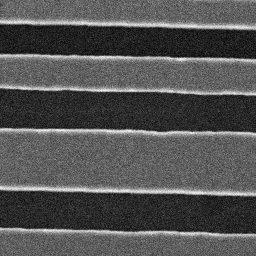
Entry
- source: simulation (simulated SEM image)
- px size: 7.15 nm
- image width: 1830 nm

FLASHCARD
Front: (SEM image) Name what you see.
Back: lines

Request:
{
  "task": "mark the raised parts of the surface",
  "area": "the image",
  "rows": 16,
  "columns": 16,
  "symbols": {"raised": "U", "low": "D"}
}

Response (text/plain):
UUUUUUUUUUUUUUUU
DDDDDDUUUUUUUUUU
DDDDDDDDDDDDDDDD
UUUUDDDDDDDDDDDD
UUUUUUUUUUUUUUUU
UUUUUUUUUUUUUUUU
DDDDDDDDDDDDDDDD
DDDDDDDDDDDDDDDD
UUUUUUUUUUUUUUUU
UUUUUUUUUUUUUUUU
UUUUUUUUUUUUUUUU
UUUUUUUUUUUUUUUU
DDDDDDDDDDDDDDDD
DDDDDDDDDDDDDDDD
UUUUUUUUDUUDDDDD
UUUUUUUUUUUUUUUU